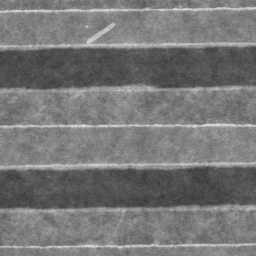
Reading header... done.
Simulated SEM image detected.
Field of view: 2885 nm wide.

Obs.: lines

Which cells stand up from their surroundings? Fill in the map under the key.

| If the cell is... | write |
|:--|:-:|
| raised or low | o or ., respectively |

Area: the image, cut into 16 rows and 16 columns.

oooooooooooooooo
oooooooooooooooo
oooooooooooooooo
................
................
................
oooooooooooooooo
oooooooooooooooo
oooooooooooooooo
oooooooooooooooo
................
................
................
oooooooooooooooo
oooooooooooooooo
oooooooooooooooo